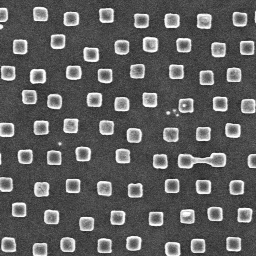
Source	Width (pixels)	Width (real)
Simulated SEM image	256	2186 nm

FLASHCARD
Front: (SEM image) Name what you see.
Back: a regular array of raised bodies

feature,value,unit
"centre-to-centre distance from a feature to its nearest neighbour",243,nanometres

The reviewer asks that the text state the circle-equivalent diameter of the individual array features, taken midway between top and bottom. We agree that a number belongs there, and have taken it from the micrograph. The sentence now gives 128 nanometers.